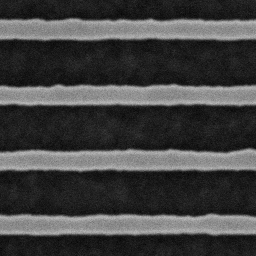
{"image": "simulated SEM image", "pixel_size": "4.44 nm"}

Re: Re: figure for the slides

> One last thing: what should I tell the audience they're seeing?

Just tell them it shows lines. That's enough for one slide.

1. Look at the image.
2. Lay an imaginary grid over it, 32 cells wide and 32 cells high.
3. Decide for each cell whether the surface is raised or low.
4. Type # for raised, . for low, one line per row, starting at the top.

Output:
................................
................................
....#...##......................
################################
################################
................................
................................
................................
................................
................................
................................
################################
################################
................................
................................
................................
................................
................................
................................
################################
################################
................................
................................
................................
................................
................................
................................
################################
################################
................................
................................
................................